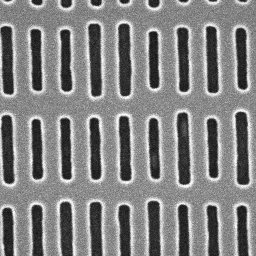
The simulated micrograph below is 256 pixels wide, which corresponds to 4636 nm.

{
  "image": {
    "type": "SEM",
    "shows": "a regular array of holes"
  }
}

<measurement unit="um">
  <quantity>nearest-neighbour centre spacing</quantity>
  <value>0.53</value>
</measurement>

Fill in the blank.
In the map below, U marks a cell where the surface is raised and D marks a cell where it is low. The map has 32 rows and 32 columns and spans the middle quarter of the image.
DDUUUUDDDDUUUUDDDUUUUDDDUUUUUDDU
DDUUUUDDDUUUUUDDDUUUUDDDUUUUUDDU
DDUUUUDDDUUUUUDDDUUUUDDDUUUUUDDU
DDUUUUDDDDUUUUDDDUUUUDDDUUUUUDDU
DDUUUUDDDDUUUUDDDUUUUDDDUUUUUDDU
DDUUUUUDDDUUUUDDDUUUUUDDUUUUUDDD
DDUUUUUDDDUUUUDDDUUUUUUUUUUUUDDU
UUUUUUUDDUUUUUDDDUUUUUUUUUUUUUUU
UUUUUUUUUUUUUUUUUUUUUUUUUUUUUUUU
UUUUUUUUUUUUUUUUUUUUUUUUUUUUUUUU
UUUUUUUUUUUUUUUUUUUUUUUUUUUUUUUU
UUUUUUUUUUUUUUUUUUUUUUUUUUUUUUUU
UUUUUUUUUUUUUUUUUUUUUUUUUUUUUDDU
DUUUUUUDUUUUUUDDUUUUUUDUUUUUDDDU
DDUUUUDDDUUUUUDDUUUUUDDDUUUUDDDU
DDUUUUDDDUUUUUDDDUUUUDDDUUUUDDDU
DDUUUUDDDUUUUUDDDUUUUDDDUUUUDDDU
DDUUUUDDDUUUUUDDDUUUUDDDUUUUDDDU
DDUUUUDDDUUUUUDDDUUUUDDDUUUUDDDU
DDUUUUDDDUUUUUDDDUUUUDDDUUUUDDDU
DDUUUUDDDUUUUUDDDUUUUDDDUUUUDDDU
DDUUUUDDDUUUUUDDDUUUUDDDUUUUDDDU
DDUUUUUDDUUUUUDDDUUUUDDDUUUUDDDU
DDUUUUUDDUUUUUDDDUUUUDDDUUUUDDDD
DDUUUUUDDUUUUUDDDUUUUDDDUUUUDDDD
DDUUUUUDDUUUUUDDDUUUUDDDUUUUDDDD
DDUUUUUDDUUUUUDDDUUUUUDDUUUUDDDD
DDUUUUUDDUUUUUDDDUUUUUDDUUUUDDDD
DDUUUUUDDUUUUUDDDUUUUUDDUUUUDDDD
UUUUUUUUUUUUUUUUUUUUUUUUUUUUUDDD
UUUUUUUUUUUUUUUUUUUUUUUUUUUUUUUU
UUUUUUUUUUUUUUUUUUUUUUUUUUUUUUUU